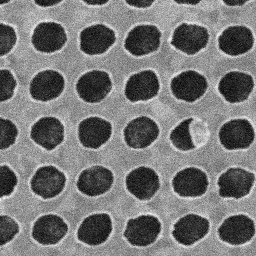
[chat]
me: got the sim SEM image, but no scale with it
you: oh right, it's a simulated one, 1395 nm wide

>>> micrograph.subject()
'a regular array of holes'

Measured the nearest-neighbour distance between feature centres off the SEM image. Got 252 nm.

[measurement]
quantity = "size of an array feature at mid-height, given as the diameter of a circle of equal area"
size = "191 nm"